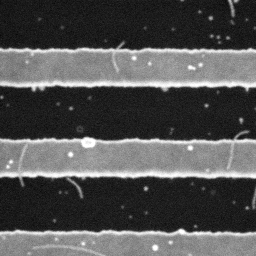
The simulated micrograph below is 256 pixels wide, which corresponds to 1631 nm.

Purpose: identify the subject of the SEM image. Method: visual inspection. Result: lines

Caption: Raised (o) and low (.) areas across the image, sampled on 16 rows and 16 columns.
................
................
................
oooooooooooooooo
oooooooooooooooo
................
................
................
................
oooooooooooooooo
oooooooooooooooo
................
................
................
oo.ooooo.o.o....
oooooooooooooooo